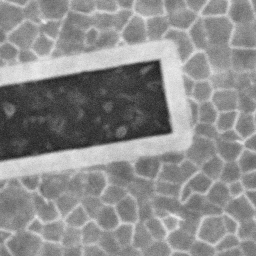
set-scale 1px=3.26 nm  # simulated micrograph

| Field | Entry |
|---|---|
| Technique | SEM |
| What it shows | one or a few lines or trenches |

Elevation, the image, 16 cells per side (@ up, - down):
@@@@@@@@@@@@@@@@
@@@@@@@@@@@@@@@@
@@@@@@@@@@@@@@@@
@@@@@@@@--@@@@@@
@@---------@@@@@
-----------@@@@@
-----------@@@@@
-----------@@@@@
-----------@@@@@
-------@@@@@@@@@
-@@@@@@@@@@@@@@@
@@@@@@@@@@@@@@@@
@@@@@@@@@@@@@@@@
@@@@@@@@@@@@@@@@
@@@@@@@@@@@@@@@@
@@@@@@@@@@@@@@@@